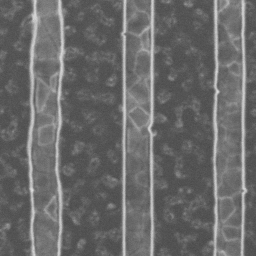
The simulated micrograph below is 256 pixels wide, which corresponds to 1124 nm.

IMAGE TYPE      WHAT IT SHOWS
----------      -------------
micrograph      one or a few lines or trenches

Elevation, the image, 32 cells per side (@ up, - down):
@@@@---@@@@@@@@@---@@@@@@@@---@@
@@@@---@@@@@@@@@---@@@@@@@@---@@
@@@@@---@@@@@@@@---@@@@@@@@---@@
@@@@----@@@@@@@@---@@@@@@@@---@@
@@@@----@@@@@@@@---@@@@@@@@---@@
@@@@----@@@@@@@@---@@@@@@@@---@@
@@@@----@@@@@@@@---@@@@@@@@---@@
@@@@----@@@@@@@@---@@@@@@@@---@@
@@@@----@@@@@@@----@@@@@@@@---@@
@@@@----@@@@@@@----@@@@@@@@---@@
@@@@---@@@@@@@@----@@@@@@@@---@@
@@@@@--@@@@@@@@@---@@@@@@@@---@@
@@@@@--@@@@@@@@@---@@@@@@@@---@@
@@@@---@@@@@@@@@---@@@@@@@@---@@
@@@@---@@@@@@@@@---@@@@@@@@---@@
@@@@---@@@@@@@@@---@@@@@@@@---@@
@@@@---@@@@@@@@@---@@@@@@@@---@@
@@@@---@@@@@@@@@---@@@@@@@@---@@
@@@@---@@@@@@@@@---@@@@@@@@---@@
@@@@---@@@@@@@@@---@@@@@@@@---@@
@@@@---@@@@@@@@@---@@@@@@@@---@@
@@@@---@@@@@@@@@---@@@@@@@@---@@
@@@@---@@@@@@@@@---@@@@@@@@---@@
@@@@---@@@@@@@@@---@@@@@@@@---@@
@@@@---@@@@@@@@@---@@@@@@@@---@@
@@@@---@@@@@@@@@---@@@@@@@@---@@
@@@@---@@@@@@@@@---@@@@@@@@---@@
@@@@---@@@@@@@@@---@@@@@@@@---@@
@@@@----@@@@@@@@---@@@@@@@@---@@
@@@@---@@@@@@@@@---@@@@@@@@---@@
@@@@---@@@@@@@@@---@@@@@@@@---@@
@@@@---@@@@@@@@@---@@@@@@@@---@@